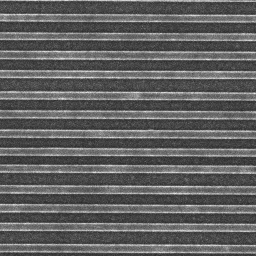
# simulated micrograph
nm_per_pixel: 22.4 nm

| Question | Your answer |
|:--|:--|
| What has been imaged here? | parallel lines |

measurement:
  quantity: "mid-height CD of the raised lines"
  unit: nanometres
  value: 171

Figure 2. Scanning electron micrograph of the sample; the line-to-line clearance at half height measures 269 nm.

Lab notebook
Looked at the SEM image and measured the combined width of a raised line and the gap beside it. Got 430 nanometers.